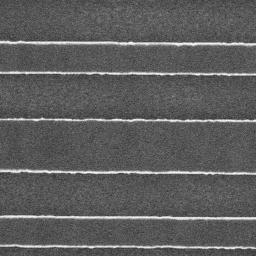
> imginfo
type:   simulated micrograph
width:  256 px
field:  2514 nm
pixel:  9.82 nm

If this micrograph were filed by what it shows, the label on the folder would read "lines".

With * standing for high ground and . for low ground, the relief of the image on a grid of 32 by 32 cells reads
................................
................................
................................
................................
................................
**********************..**.*....
********************************
********************************
********************************
................................
................................
................................
................................
................................
................................
********************************
********************************
********************************
********************************
********************************
********************************
....****************************
................................
................................
................................
................................
................................
********************************
********************************
********************************
********************************
................................